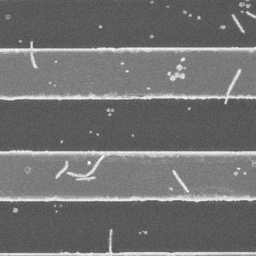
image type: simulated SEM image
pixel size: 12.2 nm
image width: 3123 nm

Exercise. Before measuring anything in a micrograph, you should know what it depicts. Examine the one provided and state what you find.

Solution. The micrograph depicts lines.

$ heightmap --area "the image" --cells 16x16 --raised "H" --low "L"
LLLLLLLLLLLLLLLL
LLLLLLLLLLLLLLLL
LLLLLLLLLLLLLLLL
HHHHHHHHHHHHHHHH
HHHHHHHHHHHHHHHH
HHHHHHHHHHHHHHHH
LLLLLLLLLLLLLLLL
LLLLLLLLLLLLLLLL
LLLLLLLLLLLLLLLL
HHLLLLLLLLLLLLLL
HHHHHHHHHHHHHHHH
HHHHHHHHHHHHHHHH
HHHHHHHHHLHHHLHL
LLLLLLLLLLLLLLLL
LLLLLLLLLLLLLLLL
LLLLLLLLLLLLLLLL